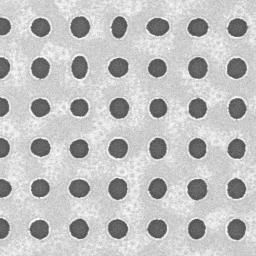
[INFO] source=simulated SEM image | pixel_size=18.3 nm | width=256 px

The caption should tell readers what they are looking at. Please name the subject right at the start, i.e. a regular array of holes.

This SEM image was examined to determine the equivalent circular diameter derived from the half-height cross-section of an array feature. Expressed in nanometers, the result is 380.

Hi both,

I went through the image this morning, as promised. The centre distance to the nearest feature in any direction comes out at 717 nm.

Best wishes